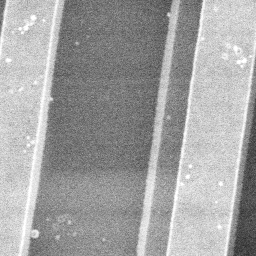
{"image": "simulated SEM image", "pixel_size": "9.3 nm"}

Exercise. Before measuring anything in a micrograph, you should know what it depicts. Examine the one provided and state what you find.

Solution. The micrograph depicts lines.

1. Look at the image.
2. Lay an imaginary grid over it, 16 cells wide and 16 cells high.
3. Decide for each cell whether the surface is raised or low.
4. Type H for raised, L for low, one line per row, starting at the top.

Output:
HHHHLLLLLLLHHHHH
HHHLLLLLLLLHHHHH
HHHLLLLLLLLHHHHH
HHHLLLLLLLLHHHHH
HHHLLLLLLLLHHHHH
HHHLLLLLLLHHHHHH
HHHLLLLLLLHHHHHL
HHHLLLLLLLHHHHHL
HHLLLLLLLLHHHHHL
HHLLLLLLLLHHHHHL
HHLLLLLLLLHHHHHL
HHLLLLLLLLHHHHHL
HHLLLLLLLHHHHHHL
HHLLLLLLLHHHHHLL
HHLLLLLLLHHHHHLL
HLLLLLLLLHHHHHLL